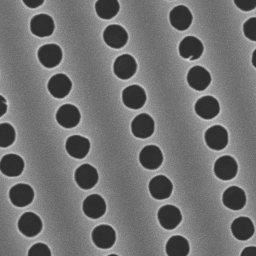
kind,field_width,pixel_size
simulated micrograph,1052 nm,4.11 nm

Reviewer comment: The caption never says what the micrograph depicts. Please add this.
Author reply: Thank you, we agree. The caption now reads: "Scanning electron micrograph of a regular array of holes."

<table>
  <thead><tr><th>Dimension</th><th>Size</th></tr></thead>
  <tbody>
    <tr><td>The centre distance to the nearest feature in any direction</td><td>128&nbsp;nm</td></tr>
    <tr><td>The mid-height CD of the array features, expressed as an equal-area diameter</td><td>99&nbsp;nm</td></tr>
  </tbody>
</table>